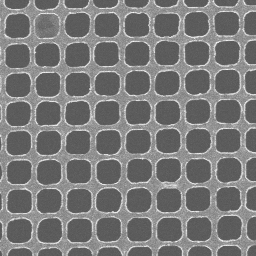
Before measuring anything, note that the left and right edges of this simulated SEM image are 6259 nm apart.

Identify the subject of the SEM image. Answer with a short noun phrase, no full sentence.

a regular array of holes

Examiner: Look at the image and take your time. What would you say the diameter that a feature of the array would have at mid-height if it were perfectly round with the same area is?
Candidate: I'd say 635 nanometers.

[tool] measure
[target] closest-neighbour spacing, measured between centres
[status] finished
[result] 29 px